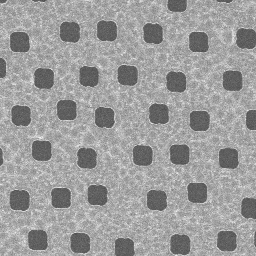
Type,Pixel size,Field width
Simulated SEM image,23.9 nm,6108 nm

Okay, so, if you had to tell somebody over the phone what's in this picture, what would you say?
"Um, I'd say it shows a regular array of holes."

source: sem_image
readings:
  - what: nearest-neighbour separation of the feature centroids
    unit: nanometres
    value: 930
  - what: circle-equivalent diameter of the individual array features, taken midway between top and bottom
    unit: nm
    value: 525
